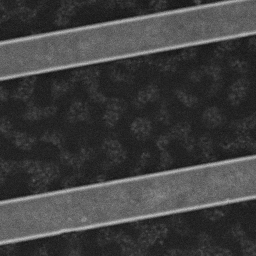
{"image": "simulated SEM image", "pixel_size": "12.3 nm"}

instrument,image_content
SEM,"one or a few lines or trenches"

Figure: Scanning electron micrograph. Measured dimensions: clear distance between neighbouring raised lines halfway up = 1510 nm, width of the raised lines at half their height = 470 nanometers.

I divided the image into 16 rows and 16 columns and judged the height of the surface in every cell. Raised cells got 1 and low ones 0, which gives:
0000000000001111
0000000111111111
0111111111111100
1111111100000000
1100000000000000
0000000000000000
0000000000000000
0000000000000000
0000000000000000
0000000000000000
0000000000001111
0000000111111111
0111111111111110
1111111110000000
1111000000000000
0000000000000000